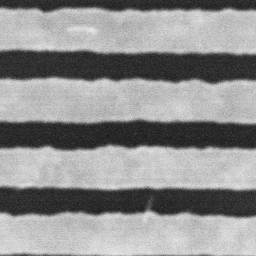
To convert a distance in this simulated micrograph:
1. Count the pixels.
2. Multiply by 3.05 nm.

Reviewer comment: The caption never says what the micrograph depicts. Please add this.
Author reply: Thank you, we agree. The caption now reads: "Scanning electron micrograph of lines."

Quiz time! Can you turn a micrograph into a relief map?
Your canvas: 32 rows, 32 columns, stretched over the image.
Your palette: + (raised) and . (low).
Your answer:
................................
+++++.++++++++.+++.+++++++.+++.+
++++++++++++++++++++++++++++++++
++++++++++++++++++++++++++++++++
++++++++++++++++++++++++++++++++
++++++++++++++++++++++++++++++++
.............+.++.....++.+..++++
................................
................................
................................
++++++++++++++++++++++++++.+++++
++++++++++++++++++++++++++++++++
++++++++++++++++++++++++++++++++
++++++++++++++++++++++++++++++++
++++++++++++++++++++++++++++++++
................................
................................
................................
.....+.......++..+++............
++++++++++++++++++++++++++++++++
++++++++++++++++++++++++++++++++
++++++++++++++++++++++++++++++++
++++++++++++++++++++++++++++++++
............+++..............+++
................................
................................
................................
++++++++++++++++++++++++++++++++
++++++++++++++++++++++++++++++++
++++++++++++++++++++++++++++++++
++++++++++++++++++++++++++++++++
++++++++++++++++++++++++++++++++